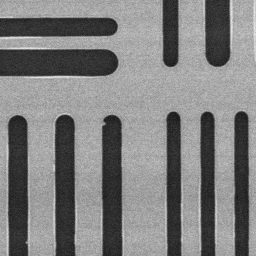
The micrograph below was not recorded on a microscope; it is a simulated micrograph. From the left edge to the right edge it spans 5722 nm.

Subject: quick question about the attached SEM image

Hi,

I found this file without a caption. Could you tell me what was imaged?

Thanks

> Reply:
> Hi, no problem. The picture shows groups of lines, slits or small figures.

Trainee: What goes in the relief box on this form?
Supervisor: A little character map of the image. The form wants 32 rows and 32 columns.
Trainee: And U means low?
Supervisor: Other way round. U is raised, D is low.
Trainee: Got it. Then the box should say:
UUUUUUUUUUUUUUUUUUUUDDUUUDDDDUUU
UUUUUUUUUUUUUUUUUUUUDDUUUDDDDUUU
DDDDDDDDDDDDDDUUUUUUDDUUUUDDDUUU
DDDDDDDDDDDDDDDUUUUUDDUUUUDDDUUU
DDDDDDDDDDDDDDUUUUUUDDUUUUDDDUUU
UUUUUUUUUUUUUUUUUUUUDDUUUUDDDUUU
DDDDDDDDDDDDDDUUUUUUDDUUUUDDDUUU
DDDDDDDDDDDDDDDUUUUUDDUUUUDDDUUU
DDDDDDDDDDDDDDDUUUUUUUUUUUUUUUUU
DDDDDDDDDDDDDUUUUUUUUUUUUUUUUUUU
UUUUUUUUUUUUUUUUUUUUUUUUUUUUUUUU
UUUUUUUUUUUUUUUUUUUUUUUUUUUUUUUU
UUUUUUUUUUUUUUUUUUUUUUUUUUUUUUUU
UUUUUUUUUUUUUUUUUUUUUUUUUUUUUUUU
UUDUUUUDDUUUUDDUUUUUUDDUUDDUUDDU
UDDUUUUDDUUUUDDUUUUUUDDUUDDUUDDU
UDDDUUUDDUUUUDDUUUUUUDDUUDDUUDDU
UDDDUUUDDUUUUDDUUUUUUDDUUDDUUDDU
UDDDUUUDDUUUUDDUUUUUUDDUUDDUUDDU
UDDDUUUDDUUUUDDUUUUUUDDUUDDUUDDU
UDDDUUUDDUUUUDDUUUUUUDDUUDDUUDDU
UDDDUUUDDUUUUDDUUUUUUDDUUDDUUDDU
UDDDUUUDDUUUUDDUUUUUUDDUUDDUUDDU
UDDDUUUDDUUUUDDUUUUUUDDUUDDUUDDU
UDDDUUUDDUUUUDDUUUUUUDDUUDDUUDDU
UDDDUUUDDUUUUDDUUUUUUDDUUDDUUDDU
UDDDUUUDDDUUUDDUUUUUUDDUUDDUUDDU
UDDDUUUDDDUUUDDUUUUUUDDUUDDUUDDU
UDDDUUUDDDUUUDDUUUUUUDDUUDDUUDDU
UDDDUUUDDUUUUDDUUUUUUDDUUDDUUDDU
UDDDUUUDDUUUUDDUUUUUUDDUUDDUUDDU
UDDDUUUDDUUUUDDUUUUUUDDUUDDUUDDU